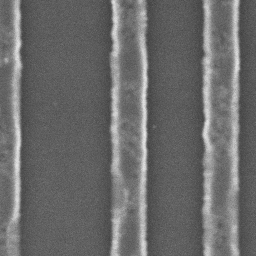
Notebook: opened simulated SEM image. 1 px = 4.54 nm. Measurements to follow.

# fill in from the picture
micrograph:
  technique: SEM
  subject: lines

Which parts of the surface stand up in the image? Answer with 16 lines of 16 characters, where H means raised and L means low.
HLLLLLLHHLLLLHHL
HLLLLLLHHLLLLHHL
HLLLLLLHHLLLLHHL
HLLLLLLHHLLLLHHL
HLLLLLLHHLLLLHHL
HLLLLLLHHLLLLHHL
HLLLLLLHHLLLLHHL
HLLLLLLHHLLLLHHL
HLLLLLLHHLLLLHHL
HLLLLLLHHLLLLHHL
HLLLLLLHHLLLLHHL
HLLLLLLHHLLLLHHL
HLLLLLLHHLLLLHHL
HLLLLLLHHLLLLHHL
HLLLLLLHHLLLLHHL
HLLLLLLHHLLLLHHL